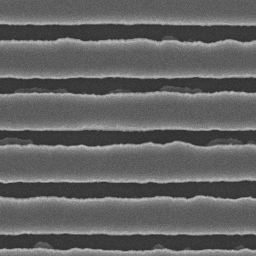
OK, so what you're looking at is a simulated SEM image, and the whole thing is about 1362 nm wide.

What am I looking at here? lines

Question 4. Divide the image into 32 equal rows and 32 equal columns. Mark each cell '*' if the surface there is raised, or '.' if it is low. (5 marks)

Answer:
********************************
********************************
********************************
................................
................................
********************************
********************************
********************************
********************************
********************************
................................
...................**.......**..
********************************
********************************
********************************
********************************
................................
................................
********************************
********************************
********************************
********************************
********************************
................................
.........................*......
********************************
********************************
********************************
********************************
................................
................................
********************************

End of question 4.